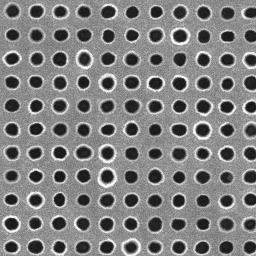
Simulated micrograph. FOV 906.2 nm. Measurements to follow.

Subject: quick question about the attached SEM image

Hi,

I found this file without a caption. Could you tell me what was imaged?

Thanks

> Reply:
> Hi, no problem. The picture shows a regular array of holes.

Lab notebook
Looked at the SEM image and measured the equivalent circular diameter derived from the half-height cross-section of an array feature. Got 45.8 nm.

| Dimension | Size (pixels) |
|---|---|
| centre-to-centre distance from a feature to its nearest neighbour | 23.2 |